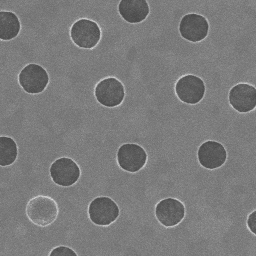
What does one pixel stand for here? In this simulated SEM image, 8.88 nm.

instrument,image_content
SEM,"a regular array of holes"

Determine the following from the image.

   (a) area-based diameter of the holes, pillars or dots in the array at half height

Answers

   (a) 258 nm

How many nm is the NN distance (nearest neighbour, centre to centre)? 545